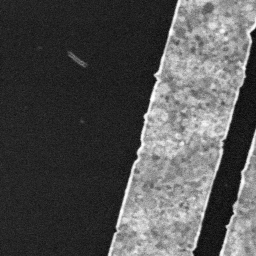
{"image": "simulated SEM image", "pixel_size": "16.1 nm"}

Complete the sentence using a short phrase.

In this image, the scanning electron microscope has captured one or a few lines or trenches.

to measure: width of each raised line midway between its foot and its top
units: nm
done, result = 1290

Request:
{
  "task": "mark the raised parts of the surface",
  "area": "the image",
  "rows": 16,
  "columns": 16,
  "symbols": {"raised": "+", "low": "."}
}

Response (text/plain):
...........+++++
...........+++++
...........+++++
..........+++++.
..........+++++.
..........+++++.
.........++++++.
.........+++++..
.........+++++..
.........+++++..
........++++++.+
........+++++..+
........+++++..+
........+++++..+
.......+++++..++
.......+++++..++